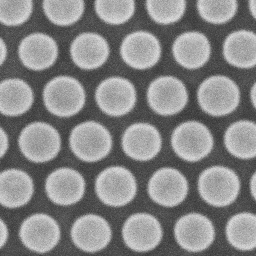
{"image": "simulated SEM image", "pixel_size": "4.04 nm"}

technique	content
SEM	a regular array of raised bodies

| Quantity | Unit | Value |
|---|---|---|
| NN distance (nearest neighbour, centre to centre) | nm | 207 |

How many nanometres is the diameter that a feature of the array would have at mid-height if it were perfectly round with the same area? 151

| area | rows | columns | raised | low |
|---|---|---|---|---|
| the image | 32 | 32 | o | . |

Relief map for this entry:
oooo..oooo..ooooo.ooooo..oooo..o
oooo..oooo..ooooo..oooo..oooo...
ooo...ooo....ooo....oo....oo....
................................
....oo....oo....ooo....oo....ooo
...oooo..oooo..ooooo..oooo..oooo
o.ooooo..oooo..ooooo..oooo..oooo
...oooo..oooo...oooo..oooo...ooo
....o...........................
................................
ooo...oooo...ooo...oooo..oooo...
oooo..oooo..ooooo..oooo..ooooo..
oooo..oooo..ooooo..oooo..ooooo..
ooo...oooo...ooo...oooo..oooo...
................................
..........oo...........oo....ooo
...oooo..oooo...oooo..oooo..oooo
o..oooo..ooooo.ooooo..oooo..oooo
o..oooo..ooooo..oooo..oooo..oooo
...oooo...ooo...ooo....oo.....oo
................................
.o.....oo....ooo....oo....ooo...
oooo..oooo..ooooo..oooo..ooooo..
oooo..oooo..ooooo..oooo..ooooo..
oooo..oooo..ooooo..oooo..oooo...
ooo..........oo.....oo.....o....
................................
...oooo...ooo...ooo....ooo...ooo
o..oooo..ooooo.ooooo..ooooo.oooo
o..oooo..ooooo..oooo..ooooo.oooo
...oooo...ooo...ooo....ooo...ooo
................................